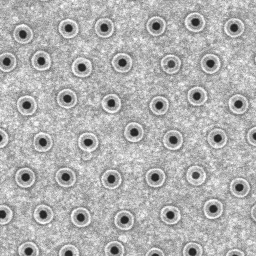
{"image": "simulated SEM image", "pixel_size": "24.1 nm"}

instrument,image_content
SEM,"a regular array of ring-shaped raised bodies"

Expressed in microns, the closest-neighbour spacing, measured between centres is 0.912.